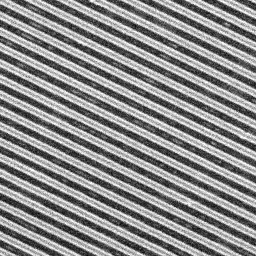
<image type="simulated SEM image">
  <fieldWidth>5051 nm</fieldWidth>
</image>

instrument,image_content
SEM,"parallel lines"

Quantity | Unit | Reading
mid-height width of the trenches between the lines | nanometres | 166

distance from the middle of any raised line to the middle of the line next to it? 278 nm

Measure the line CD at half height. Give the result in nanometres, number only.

127